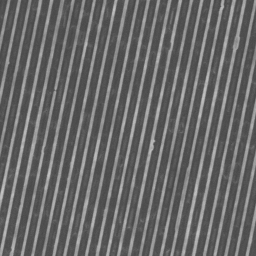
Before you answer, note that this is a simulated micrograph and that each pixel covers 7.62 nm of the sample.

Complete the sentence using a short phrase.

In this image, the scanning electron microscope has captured parallel lines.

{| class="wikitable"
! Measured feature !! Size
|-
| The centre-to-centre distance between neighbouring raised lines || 80.2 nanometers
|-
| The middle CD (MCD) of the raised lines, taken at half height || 21.5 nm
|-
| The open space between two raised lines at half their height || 7.6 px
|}